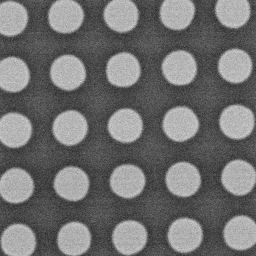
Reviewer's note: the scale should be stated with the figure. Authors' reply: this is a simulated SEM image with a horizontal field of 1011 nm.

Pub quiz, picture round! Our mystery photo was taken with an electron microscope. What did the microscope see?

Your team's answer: an array of small figures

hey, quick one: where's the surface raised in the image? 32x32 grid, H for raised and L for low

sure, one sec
HHLLLLLHHHLLLLHHHLLLHHHHLLLHHHHL
HHHLLLHHHHLLLHHHHLLLHHHHLLLHHHHL
HHHLLLHHHHLLLHHHHLLLHHHHLLLHHHHL
HHHLLLLHHHLLLLHHHLLLLHHLLLLLLLLL
LLLLLLLLLLLLLLLLLLLLLLLLLLLLLLLL
LLLLLLLLLLLLLLLLLLLLLLLLLLLLLLLL
LLLLLLLLLLLLLLLLLLLLLLHLLLLLHHLL
HHHLLLLHHHLLLLHHHLLLLHHHLLLLHHHL
HHHLLLHHHHHLLHHHHLLLHHHHHLLHHHHL
HHHHLLHHHHHLLHHHHLLLLHHHLLLLHHHL
HHHLLLLHHHLLLLHHLLLLLLHLLLLLLLLL
LLLLLLLLLLLLLLLLLLLLLLLLLLLLLLLL
LLLLLLLLLLLLLLLLLLLLLLLLLLLLLLLL
LLLLLLLLLLLLLLLLLLLLLLHLLLLLHHHL
LHHLLLLHHHLLLLHHHLLLLHHHLLLLHHHH
HHHHLLLHHHHLLLHHHHLLHHHHHLLLHHHH
HHHHLLLHHHHLLLHHHHLLLHHHHLLLHHHL
HHHLLLLHHHLLLLLHHLLLLLHLLLLLLLLL
LLLLLLLLLLLLLLLLLLLLLLLLLLLLLLLL
LLLLLLLLLLLLLLLLLLLLLLLLLLLLLLLL
LLLLLLLLLLLLLLLLLLLLLLHHLLLLLHHL
LHHLLLLLHHLLLLHHHHLLLHHHHLLLHHHH
HHHHLLLHHHHLLLHHHHLLLHHHHLLLHHHH
HHHHLLLHHHHLLLHHHHLLLHHHHLLLHHHL
HHHHLLLLHHLLLLLHHLLLLLLLLLLLLLLL
LLLLLLLLLLLLLLLLLLLLLLLLLLLLLLLL
LLLLLLLLLLLLLLLLLLLLLLLLLLLLLLLL
LLLLLLLLLLLLLLLLLLLLLLHHLLLLLHHL
LHHHLLLLHHHLLLLHHHLLLHHHHLLLHHHH
HHHHLLLHHHHLLLHHHHLLLHHHHLLLHHHH
HHHHLLLHHHHLLLHHHHLLLHHHHLLLLHHH
LHHHLLLLHHLLLLLHHLLLLLLLLLLLLLLL